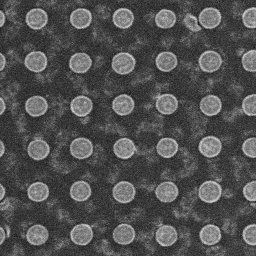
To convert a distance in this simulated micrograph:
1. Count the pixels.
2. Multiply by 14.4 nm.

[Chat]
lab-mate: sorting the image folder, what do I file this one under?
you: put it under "a regular array of raised bodies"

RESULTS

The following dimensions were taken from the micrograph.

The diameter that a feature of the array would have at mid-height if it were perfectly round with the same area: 293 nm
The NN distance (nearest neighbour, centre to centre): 612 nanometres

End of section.